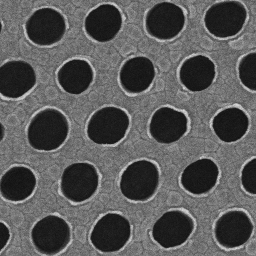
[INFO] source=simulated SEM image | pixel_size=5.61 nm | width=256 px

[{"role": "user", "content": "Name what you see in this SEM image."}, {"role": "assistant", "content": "a regular array of holes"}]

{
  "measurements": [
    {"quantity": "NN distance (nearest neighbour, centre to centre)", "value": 0.336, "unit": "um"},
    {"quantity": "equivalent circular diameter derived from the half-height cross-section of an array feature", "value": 205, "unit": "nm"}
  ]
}